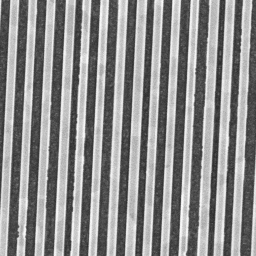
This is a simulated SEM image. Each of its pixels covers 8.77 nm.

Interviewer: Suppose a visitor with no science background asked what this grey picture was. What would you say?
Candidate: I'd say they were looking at parallel lines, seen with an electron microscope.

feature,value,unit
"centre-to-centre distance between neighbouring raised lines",157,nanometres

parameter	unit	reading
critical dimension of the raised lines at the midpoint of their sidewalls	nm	67.8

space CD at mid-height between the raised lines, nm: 91.9